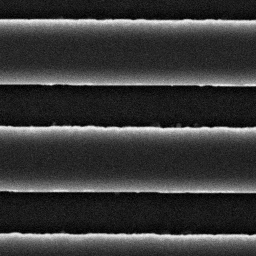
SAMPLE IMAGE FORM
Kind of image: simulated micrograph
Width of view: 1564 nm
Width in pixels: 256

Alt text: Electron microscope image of lines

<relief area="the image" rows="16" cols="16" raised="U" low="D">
DDDDDDDDDDDDDDDD
UUUUUUUUUUUUUUUU
UUUUUUUUUUUUUUUU
UUUUUUUUUUUUUUUU
UUUUUUUUUUUUUUUU
DDDDDDDDDDDDDDDD
DDDDDDDDDDDDDDDD
DDDDDDDDDDDDDDDD
UUUUUUUUUUUUUUUU
UUUUUUUUUUUUUUUU
UUUUUUUUUUUUUUUU
UUUUUUUUUUUUUUUU
DDDDDDDDDDDDDDDD
DDDDDDDDDDDDDDDD
DDDDDDDDDDDDDDDD
UUUUUUUUUUUUUUUU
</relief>